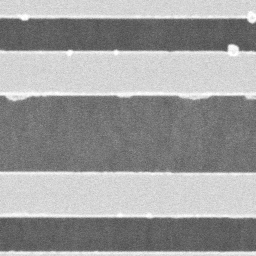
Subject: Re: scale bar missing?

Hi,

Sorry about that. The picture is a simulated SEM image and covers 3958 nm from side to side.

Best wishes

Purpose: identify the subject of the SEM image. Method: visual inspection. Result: lines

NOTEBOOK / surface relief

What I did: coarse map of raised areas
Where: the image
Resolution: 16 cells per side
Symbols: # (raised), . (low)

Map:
################
................
................
################
################
################
................
................
................
................
................
################
################
################
................
................